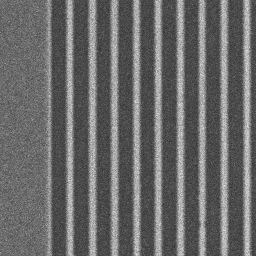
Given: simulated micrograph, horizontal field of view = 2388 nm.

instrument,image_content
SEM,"parallel lines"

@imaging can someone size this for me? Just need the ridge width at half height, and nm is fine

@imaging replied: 45.5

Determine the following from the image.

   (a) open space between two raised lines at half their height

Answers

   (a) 162 nm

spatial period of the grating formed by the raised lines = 206 nm